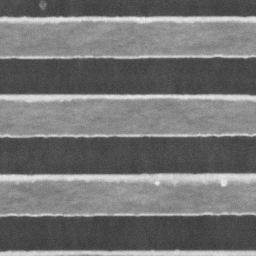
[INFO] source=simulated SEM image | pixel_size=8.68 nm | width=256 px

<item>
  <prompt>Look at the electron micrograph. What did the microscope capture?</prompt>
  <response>lines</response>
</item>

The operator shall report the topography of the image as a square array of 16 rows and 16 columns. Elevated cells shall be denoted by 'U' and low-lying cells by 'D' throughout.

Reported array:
DDDDDDDDDDDDDDDD
UUUUUUUUUUUUUUUU
UUUUUUUUUUUUUUUU
UUUUUUUUUUUUUUUU
DDDDDDDDDDDDDDDD
DDDDDDDDDDDDDDDD
UUUUUUUUUUUUUUUU
UUUUUUUUUUUUUUUU
UUUUUUUUUUUUUUUU
DDDDDDDDDDDDDDDD
DDDDDDDDDDDDDDDD
UUUUUUUUUUUUUUUU
UUUUUUUUUUUUUUUU
DDDDDDDDDDDDDDDD
DDDDDDDDDDDDDDDD
DDDDDDDDDDDDDDDD